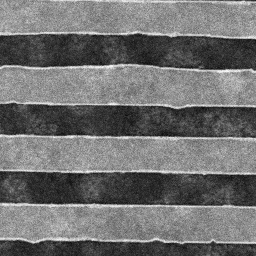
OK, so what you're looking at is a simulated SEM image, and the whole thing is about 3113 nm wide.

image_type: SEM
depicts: one or a few lines or trenches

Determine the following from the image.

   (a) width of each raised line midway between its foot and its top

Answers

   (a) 0.427 microns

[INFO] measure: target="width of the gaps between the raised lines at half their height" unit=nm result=404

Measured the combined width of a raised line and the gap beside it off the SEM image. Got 0.833 µm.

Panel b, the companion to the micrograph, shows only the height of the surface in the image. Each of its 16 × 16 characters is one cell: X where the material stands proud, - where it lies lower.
XXXXXXXXXXXXXXXX
XXXXXXXXXXXXXXXX
----------------
----------------
XXXXXXXXXXXXXXXX
XXXXXXXXXXXXXXXX
---XX--XXXXXXXXX
----------------
XX--------------
XXXXXXXXXXXXXXXX
XXXXXXXXXXXXXXXX
----------------
----------------
XXXXXXXXXXXXXXXX
XXXXXXXXXXXXXXXX
----------------